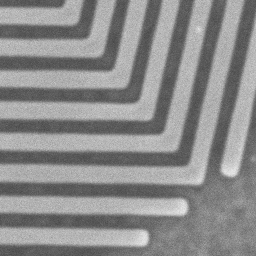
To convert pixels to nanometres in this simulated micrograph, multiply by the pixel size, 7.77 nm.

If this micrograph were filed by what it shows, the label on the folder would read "groups of lines, slits or small figures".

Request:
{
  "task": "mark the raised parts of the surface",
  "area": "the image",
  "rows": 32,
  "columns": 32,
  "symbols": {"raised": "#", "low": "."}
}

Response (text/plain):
........##..##..##..##..##..##..
##########..##..##..##..##..##..
##########..##..##..##..##..##..
............##..##..##..##..##..
...........##..##..##..##..##..#
#############..##..##..##..##..#
#############..##..##..##..##..#
...............##..##..##..##..#
..............##..##...##..##..#
################..##..##..##..##
################..##..##..##..##
..................##..##..##..##
.................###..##..##..##
###################..##..##..##.
###################..##..##..##.
.....................##..##..##.
.....................##..##..##.
######################..##...##.
######################..##..##..
........................##..##..
........................##..##..
##########################..##..
#########################.......
................................
................................
#######################.........
...####################.........
................................
................................
##################..............
........##########..............
................................